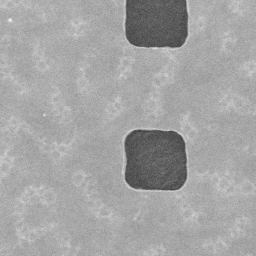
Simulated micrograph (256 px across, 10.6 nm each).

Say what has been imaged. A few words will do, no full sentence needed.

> holes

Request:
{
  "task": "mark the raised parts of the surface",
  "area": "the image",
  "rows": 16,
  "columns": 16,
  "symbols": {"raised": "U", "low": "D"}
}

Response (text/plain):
UUUUUUUUDDDDUUUU
UUUUUUUUDDDDUUUU
UUUUUUUUDDDDUUUU
UUUUUUUUUUUUUUUU
UUUUUUUUUUUUUUUU
UUUUUUUUUUUUUUUU
UUUUUUUUUUUUUUUU
UUUUUUUUUUUUUUUU
UUUUUUUUDDDUUUUU
UUUUUUUUDDDDUUUU
UUUUUUUUDDDDUUUU
UUUUUUUUDDDDUUUU
UUUUUUUUUUUUUUUU
UUUUUUUUUUUUUUUU
UUUUUUUUUUUUUUUU
UUUUUUUUUUUUUUUU